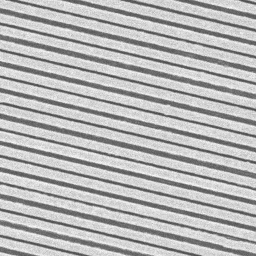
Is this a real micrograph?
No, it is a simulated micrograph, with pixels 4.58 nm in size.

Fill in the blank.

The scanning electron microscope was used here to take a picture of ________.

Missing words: parallel lines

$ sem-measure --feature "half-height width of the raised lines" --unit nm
39.6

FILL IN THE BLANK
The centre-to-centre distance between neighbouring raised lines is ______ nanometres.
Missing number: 59.2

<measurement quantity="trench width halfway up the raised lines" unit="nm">21.8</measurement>